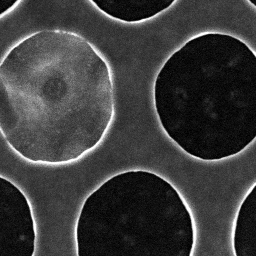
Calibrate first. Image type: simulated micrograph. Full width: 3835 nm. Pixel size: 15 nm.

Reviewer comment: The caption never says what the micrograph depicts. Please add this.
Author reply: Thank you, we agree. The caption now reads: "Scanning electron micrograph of holes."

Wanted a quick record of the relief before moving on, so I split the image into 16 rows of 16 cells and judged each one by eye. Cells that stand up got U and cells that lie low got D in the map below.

DUUUUUDDDDUUUUUU
UUUUUUUUUUUUUUUU
UUUUUUUUUUUUDDDU
UUUUUUUUUUUDDDDD
UUUUUUUUUUDDDDDD
UUUUUUUUUUDDDDDD
UUUUUUUUUUDDDDDD
UUUUUUUUUUDDDDDD
UUUUUUUUUUUDDDDD
UUUUUUUUUUUUDDDU
UUUUUUUUUUUUUUUU
DUUUUUDDDDDUUUUU
DDUUUDDDDDDUUUUD
DDUUUDDDDDDDUUUD
DDUUUDDDDDDDUUUD
DDUUUDDDDDDDUUUD